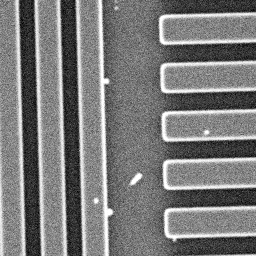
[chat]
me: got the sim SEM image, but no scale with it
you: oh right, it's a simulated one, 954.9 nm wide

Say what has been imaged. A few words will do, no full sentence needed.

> groups of lines, slits or small figures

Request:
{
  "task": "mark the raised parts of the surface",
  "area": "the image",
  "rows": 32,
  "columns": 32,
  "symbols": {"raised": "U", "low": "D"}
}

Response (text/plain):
UUDDUUUDDDUUUDDDDDDDDDDDDDDDDDDD
UUDDUUUDDDUUUDDDDDDDDDDDDDDDDDDD
UUDDUUUUDDUUUDDDDDDDUUUUUUUUUUUU
UUDDDUUUDDUUUDDDDDDDUUUUUUUUUUUU
UUDDDUUUDDUUUDDDDDDDUUUUUUUUUUUU
UUDDDUUUDDUUUDDDDDDDDUDDDDDDDDDD
UUDDDUUUDDUUUDDDDDDDDDDDDDDDDDDD
UUDDDUUUDDUUUDDDDDDDDDDDDDDDDDDD
UUDDDUUUDDUUUDDDDDDDUUUUUUUUUUUU
UUDDDUUUDDUUUDDDDDDDUUUUUUUUUUUU
UUDDDUUUDDUUUDDDDDDDUUUUUUUUUUUU
UUDDDUUUDDUUUDDDDDDDDDDDDDDDDDDD
UUUDDUUUDDUUUDDDDDDDDDDDDDDDDDDD
UUUDDUUUDDUUUDDDDDDDDDDDDDDDDDDD
UUUDDUUUDDUUUDDDDDDDUUUUUUUUUUUU
UUUDDUUUDDUUUDDDDDDDUUUUUUUUUUUU
UUUDDUUUDDUUUDDDDDDDUUUUUUUUUUUU
UUUDDUUUDDUUUDDDDDDDDUDDDDDDDDDD
UUUDDUUUDDUUUDDDDDDDDDDDDDDDDDDD
UUUDDUUUDDUUUDDDDDDDDDDDDDDDDDDD
UUUDDUUUDDUUUDDDDDDDDUUUUUUUUUUU
UUUDDUUUDDUUUDDDDDDDDUUUUUUUUUUU
UUUDDUUUDDUUUDDDDDDDDUUUUUUUUUUU
UUUDDUUUDDUUUDDDDDDDDUUUUDDDDDDD
UUUDDUUUDDUUUDDDDDDDDDDDDDDDDDDD
UUUDDUUUDDUUUDDDDDDDDDDDDDDDDDDD
UUUDDUUUDDUUUDDDDDDDDUUUUUUUUUUU
UUUDDUUUDDUUUDDDDDDDDUUUUUUUUUUU
UUUDDUUUDDUUUDDDDDDDDUUUUUUUUUUU
UUUDDUUUDDUUUDDDDDDDDUUUUUUDDDDD
UUUDDUUUDDUUUDDDDDDDDDDDDDDDDDDD
UUUDDUUUDDUUUDDDDDDDDDDDDDDDDDDD